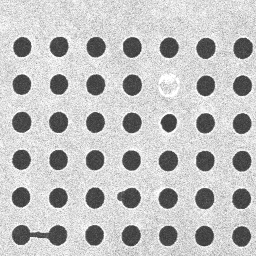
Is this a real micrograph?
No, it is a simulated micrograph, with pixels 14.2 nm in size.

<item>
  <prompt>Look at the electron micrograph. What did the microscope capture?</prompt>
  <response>a regular array of holes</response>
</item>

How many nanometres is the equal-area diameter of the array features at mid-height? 286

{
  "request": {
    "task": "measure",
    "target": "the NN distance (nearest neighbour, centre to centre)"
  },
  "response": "0.52 micrometres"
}